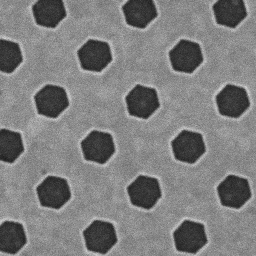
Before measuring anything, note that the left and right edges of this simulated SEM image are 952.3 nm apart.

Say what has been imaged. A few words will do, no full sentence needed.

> a regular array of holes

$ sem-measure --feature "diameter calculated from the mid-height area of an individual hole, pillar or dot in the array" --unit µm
0.128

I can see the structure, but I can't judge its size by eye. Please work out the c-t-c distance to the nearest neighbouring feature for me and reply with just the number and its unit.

235 nm